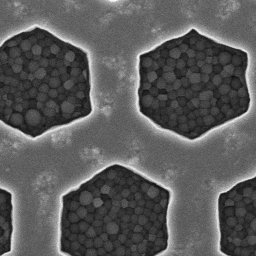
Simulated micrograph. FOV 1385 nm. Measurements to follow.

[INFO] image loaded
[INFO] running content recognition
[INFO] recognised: holes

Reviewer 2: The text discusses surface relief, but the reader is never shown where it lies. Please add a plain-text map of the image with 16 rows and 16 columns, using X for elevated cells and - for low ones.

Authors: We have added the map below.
XXXXXXXXXXXXXXXX
XXXXXXXXXXXXXXXX
----XXXXXXX--XXX
-----XXXX------X
------XXX------X
------XXX------X
------XXX-------
-----XXXX-----XX
XXXXXXXXXXX--XXX
XXXXXXXXXXXXXXXX
XXXXXXX-XXXXXXXX
XXXXX-----XXXXX-
-XXX-------XXX--
-XXX------XXXX--
-XXX------XXXX--
-XXX------XXXX--